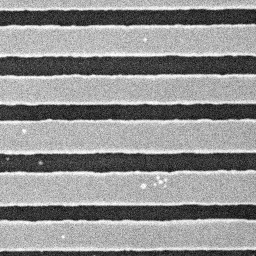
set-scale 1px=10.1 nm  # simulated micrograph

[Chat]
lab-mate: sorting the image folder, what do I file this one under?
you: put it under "lines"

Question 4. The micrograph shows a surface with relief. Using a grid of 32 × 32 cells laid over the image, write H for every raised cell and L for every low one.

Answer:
HHHHHHHHHHHHHHHHHHHHHHHHHHHHHHHH
LLLLLLLLLLLLLLLLLLLLLLLLLLLLLLLL
LLLLLLLLLLLLLLLLLLLLLLLLLLLLLLLL
HHHHHHHHHHHHHHHHHHHHHHHHHHHHHHHH
HHHHHHHHHHHHHHHHHHHHHHHHHHHHHHHH
HHHHHHHHHHHHHHHHHHHHHHHHHHHHHHHH
HHHHHHHHHHHHHHHHHHHHHHHHHHHHHHHH
LLLLLLLLLLLLLLLLLLLLLLLLLLLLLLLL
LLLLLLLLLLLLLLLLLLLLLLLLLLLLLLLL
LLLLLLHHHHHHHHHHHHHHHHHHHHHHHHHH
HHHHHHHHHHHHHHHHHHHHHHHHHHHHHHHH
HHHHHHHHHHHHHHHHHHHHHHHHHHHHHHHH
HHHHHHHHHHHHHHHHHHHHHHHHHHHHHHHH
LLLLLLLLLLLLLLLLLLLLLLLLLLLLLLLL
LLLLLLLLLLLLLLLLLLLLLLLLLLLLLLLL
HHHHHHHHHHHHHHHHHHHHHHHHHHHHHHHH
HHHHHHHHHHHHHHHHHHHHHHHHHHHHHHHH
HHHHHHHHHHHHHHHHHHHHHHHHHHHHHHHH
HHHHHHHHHHHHHHHHHHHHHHHHHHHHHHHH
LLLLLLLLLLLLLLLLLLLLLLLLLLLLLLLL
LLLLLLLLLLLLLLLLLLLLLLLLLLLLLLLL
LLLLLLLLLLLLLLLLLLLLLLHHHHHHHHHH
HHHHHHHHHHHHHHHHHHHHHHHHHHHHHHHH
HHHHHHHHHHHHHHHHHHHHHHHHHHHHHHHH
HHHHHHHHHHHHHHHHHHHHHHHHHHHHHHHH
HHHHHHHHHHHHHHHHHHHHHHHLLHHHLLLL
LLLLLLLLLLLLLLLLLLLLLLLLLLLLLLLL
LLLLLLLLLLLLLLLLLLLLLLLLLLHHHHHL
HHHHHHHHHHHHHHHHHHHHHHHHHHHHHHHH
HHHHHHHHHHHHHHHHHHHHHHHHHHHHHHHH
HHHHHHHHHHHHHHHHHHHHHHHHHHHHHHHH
LLLLLLLLLLLLLLLLLLLLLLLLLLLLLLLL